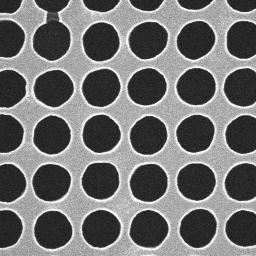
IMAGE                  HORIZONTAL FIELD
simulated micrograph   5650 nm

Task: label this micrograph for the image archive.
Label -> a regular array of holes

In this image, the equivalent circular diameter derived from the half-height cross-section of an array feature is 0.845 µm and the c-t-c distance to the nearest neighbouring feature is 1.03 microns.